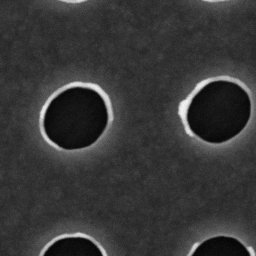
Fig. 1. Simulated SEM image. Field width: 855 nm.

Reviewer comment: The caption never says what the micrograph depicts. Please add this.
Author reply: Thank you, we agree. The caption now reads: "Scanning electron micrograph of holes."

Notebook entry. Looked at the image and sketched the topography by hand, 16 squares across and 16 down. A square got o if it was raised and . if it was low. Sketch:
oooooooooooooooo
oooooooooooooooo
oooooooooooooooo
oooooooooooooooo
oooooooooooooooo
ooooooooooooo..o
ooo....ooooo....
ooo....ooooo....
ooo...oooooo...o
oooooooooooooooo
oooooooooooooooo
oooooooooooooooo
oooooooooooooooo
oooooooooooooooo
oooooooooooooooo
ooo...oooooo...o